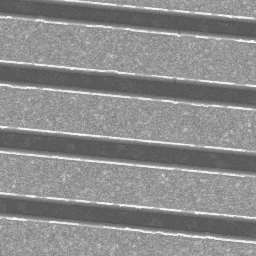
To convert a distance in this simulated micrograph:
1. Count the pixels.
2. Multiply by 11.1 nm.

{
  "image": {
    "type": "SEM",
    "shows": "one or a few lines or trenches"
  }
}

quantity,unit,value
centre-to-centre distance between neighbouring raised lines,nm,740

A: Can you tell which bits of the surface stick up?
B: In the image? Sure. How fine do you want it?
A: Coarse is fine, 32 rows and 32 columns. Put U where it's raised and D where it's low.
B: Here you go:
DDDDDDDDDDUUUUUUUUUUUUUUUUUUUUUU
DDDDDDDDDDDDDDDDDDDDUUUUUUUUUUUU
UUUUUUUDDDDDDDDDDDDDDDDDDDDDDDUU
UUUUUUUUUUUUUUUUUDDDDDDDDDDDDDDD
UUUUUUUUUUUUUUUUUUUUUUUUUUUUDDDD
UUUUUUUUUUUUUUUUUUUUUUUUUUUUUUUU
UUUUUUUUUUUUUUUUUUUUUUUUUUUUUUUU
UUUUUUUUUUUUUUUUUUUUUUUUUUUUUUUU
DDDDDDUUUUUUUUUUUUUUUUUUUUUUUUUU
DDDDDDDDDDDDDDDDUUUUUUUUUUUUUUUU
UUDDDDDDDDDDDDDDDDDDDDDDDDUUUUUU
UUUUUUUUUUUUUDDDDDDDDDDDDDDDDDDD
UUUUUUUUUUUUUUUUUUUUUUDDDDDDDDDD
UUUUUUUUUUUUUUUUUUUUUUUUUUUUUUUU
UUUUUUUUUUUUUUUUUUUUUUUUUUUUUUUU
UUUUUUUUUUUUUUUUUUUUUUUUUUUUUUUU
DDDDUUUUUUUUUUUUUUUUUUUUUUUUUUUU
DDDDDDDDDDDDDDUUUUUUUUUUUUUUUUUU
DDDDDDDDDDDDDDDDDDDDDDDDUUUUUUUU
UUUUUUUUDDDDDDDDDDDDDDDDDDDDDDDD
UUUUUUUUUUUUUUUUUUDDDDDDDDDDDDDD
UUUUUUUUUUUUUUUUUUUUUUUUUUUUUDDD
UUUUUUUUUUUUUUUUUUUUUUUUUUUUUUUU
UUUUUUUUUUUUUUUUUUUUUUUUUUUUUUUU
DUUUUUUUUUUUUUUUUUUUUUUUUUUUUUUU
DDDDDDDDDDDUUUUUUUUUUUUUUUUUUUUU
DDDDDDDDDDDDDDDDDDDDDUUUUUUUUUUU
UUUUUUUDDDDDDDDDDDDDDDDDDDDDDDDU
UUUUUUUUUUUUUUUUUDDDDDDDDDDDDDDD
UUUUUUUUUUUUUUUUUUUUUUUUUUUDDDDD
UUUUUUUUUUUUUUUUUUUUUUUUUUUUUUUU
UUUUUUUUUUUUUUUUUUUUUUUUUUUUUUUU